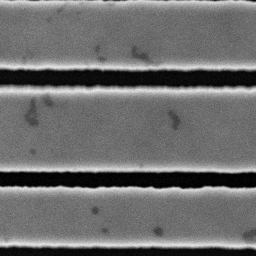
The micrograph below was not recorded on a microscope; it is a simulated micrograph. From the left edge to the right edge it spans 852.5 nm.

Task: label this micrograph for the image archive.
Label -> lines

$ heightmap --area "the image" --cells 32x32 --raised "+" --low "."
++++++++++++++++++++++++++++++++
++++++++++++++++++++++++++++++++
++++++++++++++++++++++++++++++++
++++++++++++++++++++++++++++++++
++++++++++++++++++++++++++++++++
++++++++++++++++++++++++++++++++
++++++++++++++++++++++++++++++++
++++++++++++++++++++++++++++++++
++++++++++++++++++++++++++++++++
................................
................................
++++++++++++++++++++++++++++++++
++++++++++++++++++++++++++++++++
++++++++++++++++++++++++++++++++
++++++++++++++++++++++++++++++++
++++++++++++++++++++++++++++++++
++++++++++++++++++++++++++++++++
++++++++++++++++++++++++++++++++
++++++++++++++++++++++++++++++++
++++++++++++++++++++++++++++++++
++++++++++++++++++++++++++++++++
...........+...............++++.
................................
+++++++++++.+++++++++++..+++++++
++++++++++++++++++++++++++++++++
++++++++++++++++++++++++++++++++
++++++++++++++++++++++++++++++++
++++++++++++++++++++++++++++++++
++++++++++++++++++++++++++++++++
++++++++++++++++++++++++++++++++
++++++++++++++++++++++++++++++++
................................